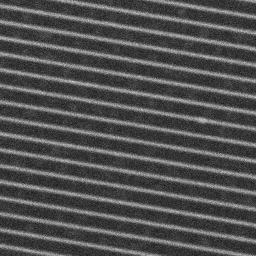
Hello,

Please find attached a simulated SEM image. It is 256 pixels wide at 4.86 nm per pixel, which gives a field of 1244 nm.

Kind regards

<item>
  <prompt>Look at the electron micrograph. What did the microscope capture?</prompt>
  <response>parallel lines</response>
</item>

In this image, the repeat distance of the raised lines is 0.0768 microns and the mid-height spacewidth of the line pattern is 13.2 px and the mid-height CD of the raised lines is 12.5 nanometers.